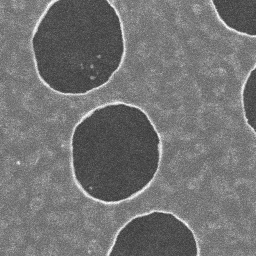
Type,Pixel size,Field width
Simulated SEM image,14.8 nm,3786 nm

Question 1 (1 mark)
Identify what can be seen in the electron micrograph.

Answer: holes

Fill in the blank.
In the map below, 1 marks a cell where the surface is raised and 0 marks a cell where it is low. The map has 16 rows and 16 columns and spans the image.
1110000111111000
1100000011111100
1100000011111111
1100000011111111
1100000111111111
1110001111111110
1111111111111110
1111100001111110
1111100000111111
1111100000111111
1111100000111111
1111100001111111
1111110011111111
1111111110011111
1111111000001111
1111111000001111